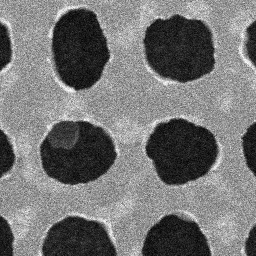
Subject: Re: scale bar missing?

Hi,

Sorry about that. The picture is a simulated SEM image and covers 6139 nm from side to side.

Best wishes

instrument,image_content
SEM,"holes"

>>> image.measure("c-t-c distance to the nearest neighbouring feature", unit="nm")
2440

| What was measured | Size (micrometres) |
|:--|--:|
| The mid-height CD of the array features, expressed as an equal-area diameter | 1.68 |